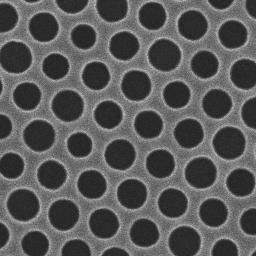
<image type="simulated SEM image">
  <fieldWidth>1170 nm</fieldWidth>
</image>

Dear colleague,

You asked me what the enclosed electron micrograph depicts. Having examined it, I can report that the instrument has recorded a regular array of holes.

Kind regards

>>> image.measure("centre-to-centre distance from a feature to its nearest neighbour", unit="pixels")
40.9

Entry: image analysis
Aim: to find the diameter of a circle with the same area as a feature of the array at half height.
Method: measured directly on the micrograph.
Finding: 0.132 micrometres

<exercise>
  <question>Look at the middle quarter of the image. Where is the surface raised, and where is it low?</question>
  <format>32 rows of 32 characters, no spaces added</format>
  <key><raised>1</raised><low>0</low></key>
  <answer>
01111000000111111111110000001111
01111000000111111111111100011111
01111000000111100000011111111111
11111000000011100000011111111111
11111000000111000000001111110111
11111100001111000000001111000001
11111110111111000000001110000001
00011111111111100000011110000000
00001111111111110000111110000001
00000111110011111111111110000001
00000111000000111111111111000011
00000111000000111111111111111111
00001111000000011110000111111111
00001111000000011100000011111111
11111111000000111100000001111000
11111111100001111100000001110000
11111111111111111100000011110000
11100111111111111110000011100000
10000011111111111111001111110000
10000001111100001111111111110000
10000001111000000111111111111000
10000001110000000011111001111111
11000011110000000011110000011111
11111111110000000011100000011111
11111111111000000111100000001110
11111111111100000111100000001110
11111111111111011111100000011100
01110000011111111111110000011100
01110000001111111111111001111100
11100000001111100001111111111110
11100000000111000000111111111111
11110000001110000000011110001111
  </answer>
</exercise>